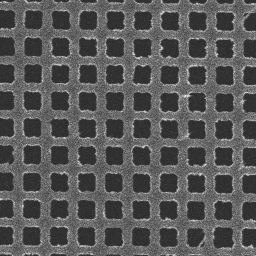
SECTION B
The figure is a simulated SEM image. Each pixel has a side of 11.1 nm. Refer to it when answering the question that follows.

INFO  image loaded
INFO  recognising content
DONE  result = a regular array of holes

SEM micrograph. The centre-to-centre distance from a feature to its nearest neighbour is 0.299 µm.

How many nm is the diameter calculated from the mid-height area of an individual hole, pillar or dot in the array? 221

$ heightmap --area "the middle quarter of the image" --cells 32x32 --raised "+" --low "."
.+++....+++...++++.+.++++...++++
.+++....++.....+++....++.....++.
.+++....+++....++.....++.....++.
.+++....+++....++.....++.....++.
.+++....+++....+++....++....+++.
++++++++++++++++++++++++++++++++
++++++++++++++++++++++++++++++++
.+++....+++....++.....++....++++
.+++....++.....++.....++.....++.
.+++....++.....++.....++.....++.
.+++....++.....++.....++.....++.
.+++....+++....+++...+++....+++.
++++++++++++++++++++++++++++++++
++++++++++++++++++++++++++++++++
.+++....++.....++.....++....+++.
.+++....++.....++.....++.....++.
.+++....+++....++.....++.....++.
.+++....++.....++.....++.....++.
++++++++++++..++++...++++...+++.
++++++++++++++++++++++++++++++++
++++.+++++++++++++++++++++++++++
.++.....++.....++....+++.....++.
.+++....++.....++.....++.....++.
.+++....++.....++.....++.....++.
.+++....+++....++.....++.....++.
++++++++++++++++++++++++++++++++
++++++++++++++++++++++++++++++++
++++....+++..+++++..++++....++++
.++.....++.....++.....++.....++.
.+++....++.....++.....++.....++.
.+++....++.....++.....++....+++.
.+++....++.....++.....++....+++.